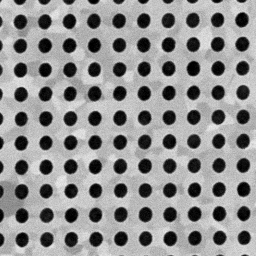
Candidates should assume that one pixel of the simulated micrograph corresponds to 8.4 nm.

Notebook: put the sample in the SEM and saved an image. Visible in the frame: a regular array of holes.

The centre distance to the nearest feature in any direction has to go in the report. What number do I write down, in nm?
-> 201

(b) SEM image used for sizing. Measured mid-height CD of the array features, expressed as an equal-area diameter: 124 nm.